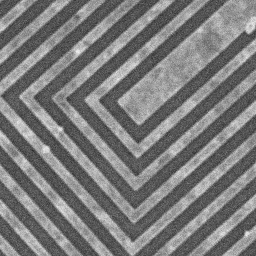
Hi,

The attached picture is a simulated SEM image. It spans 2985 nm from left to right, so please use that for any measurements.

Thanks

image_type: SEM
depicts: groups of lines, slits or small figures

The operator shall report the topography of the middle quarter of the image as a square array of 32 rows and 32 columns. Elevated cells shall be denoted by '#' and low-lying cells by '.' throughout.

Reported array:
#.....###......###.....#########
.....###.....####.....##########
....###.....####.....###########
...###.....###......############
..###.....###......############.
####.....###......############..
###.....###......############...
#......###......###########.....
......###.....############......
#.....###.....###########......#
##.....###....##########.....###
###.....##.....########.....####
.###....###.....######.....###..
.###.....###.....####.....###...
..###.....###.....##.....###....
...###.....###..........###.....
....###.....###........###.....#
.....###.....###......###.....##
#.....###.....###....###.....###
##.....###.....###.####.....###.
###.....###.....######.....###..
.###.....###.....###......###...
..###.....###.....#......###....
...###.....##...........###.....
....###....###.........###.....#
....###.....###......####.....##
.....###.....###....####.....###
#.....###.....###..###......###.
##.....###.....######......###..
.##.....###.....####......###...
.###.....###.....##......###....
..###.....###..........####.....